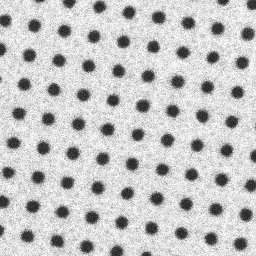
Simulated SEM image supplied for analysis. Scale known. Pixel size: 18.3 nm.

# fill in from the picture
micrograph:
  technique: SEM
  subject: a regular array of holes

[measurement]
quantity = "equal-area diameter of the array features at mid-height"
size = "246 nm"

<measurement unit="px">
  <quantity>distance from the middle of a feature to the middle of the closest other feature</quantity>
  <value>29.7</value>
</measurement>